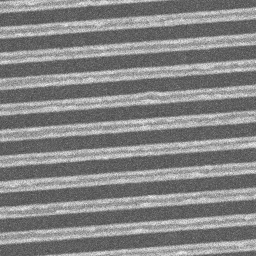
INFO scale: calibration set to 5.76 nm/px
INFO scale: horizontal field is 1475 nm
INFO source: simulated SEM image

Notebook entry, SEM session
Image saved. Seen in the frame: parallel lines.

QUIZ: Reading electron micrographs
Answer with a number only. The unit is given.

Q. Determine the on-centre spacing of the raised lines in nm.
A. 148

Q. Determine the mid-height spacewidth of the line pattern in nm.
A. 87.6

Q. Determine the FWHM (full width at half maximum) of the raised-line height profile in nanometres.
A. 58.1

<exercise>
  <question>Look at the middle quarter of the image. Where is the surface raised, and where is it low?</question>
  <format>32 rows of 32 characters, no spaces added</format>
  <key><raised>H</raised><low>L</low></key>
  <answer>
LLLLLLLLLLLLLLLLLLLLLLLLLLLLLLLH
LLLLLLLLLLLLLLLLLHHHHHHHHHHHHHHH
LLHLLHHHHHHHHHHHHHHHHHHHHHHHHHHH
HHHHHHHHHHHHHHHHHHHLLLLLLLLLLLLL
HHHHHHLLLLLLLLLLLLLLLLLLLLLLLLLL
LLLLLLLLLLLLLLLLLLLLLLLLLLLLLLLL
LLLLLLLLLLLLLLLLLLLLLLLLLLLLLLLL
LLLLLLLLLLLLLLLLLLLHHHHHHHHHHHHH
LLLLLLLLLHHHHHHHHHHHHHHHHHHHHHHH
HHHHHHHHHHHHHHHHHHHHHHHHHHLLLLLL
HHHHHHHHHHHHLLLLLLLLLLLLLLLLLLLL
LLLLLLLLLLLLLLLLLLLLLLLLLLLLLLLL
LLLLLLLLLLLLLLLLLLLLLLLLLLLLLLLL
LLLLLLLLLLLLLLLLLLLLLLLLLLHHHHHH
LLLLLLLLLLLLLHHHHHHHHHHHHHHHHHHH
HHHHHHHHHHHHHHHHHHHHHHHHHHHHHHHL
HHHHHHHHHHHHHHHHHHLLLLLLLLLLLLLL
HHHHHLLLLLLLLLLLLLLLLLLLLLLLLLLL
LLLLLLLLLLLLLLLLLLLLLLLLLLLLLLLL
LLLLLLLLLLLLLLLLLLLLLLLLLLLLLLLL
LLLLLLLLLLLLLLLLLLLLHHHHHHHHHHHH
LLLLLLLHHHHHHHHHHHHHHHHHHHHHHHHH
HHHHHHHHHHHHHHHHHHHHHHLLLLLLLLLL
HHHHHHHHHHHHLLLLLLLLLLLLLLLLLLLL
LLLLLLLLLLLLLLLLLLLLLLLLLLLLLLLL
LLLLLLLLLLLLLLLLLLLLLLLLLLLLLLLL
LLLLLLLLLLLLLLLLLLLLLLLLHHHHHHHH
LLLLLLLLLLLLHHHHHHHHHHHHHHHHHHHH
HHHHHHHHHHHHHHHHHHHHHHHHHHHHHLLL
HHHHHHHHHHHHHHHHLLLLLLLLLLLLLLLL
HHHLLLLLLLLLLLLLLLLLLLLLLLLLLLLL
LLLLLLLLLLLLLLLLLLLLLLLLLLLLLLLL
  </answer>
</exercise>